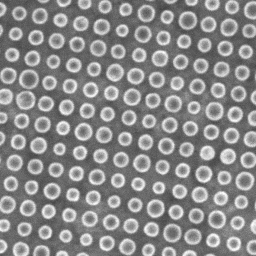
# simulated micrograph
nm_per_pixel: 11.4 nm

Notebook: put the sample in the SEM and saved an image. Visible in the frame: a regular array of raised bodies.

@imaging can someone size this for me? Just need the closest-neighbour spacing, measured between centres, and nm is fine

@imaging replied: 235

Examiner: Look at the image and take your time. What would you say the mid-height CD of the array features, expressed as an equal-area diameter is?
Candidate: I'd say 158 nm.